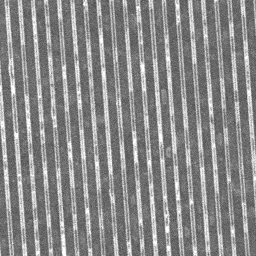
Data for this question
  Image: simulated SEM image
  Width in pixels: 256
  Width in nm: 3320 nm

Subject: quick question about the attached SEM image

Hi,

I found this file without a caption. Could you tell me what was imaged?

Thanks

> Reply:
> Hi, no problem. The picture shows parallel lines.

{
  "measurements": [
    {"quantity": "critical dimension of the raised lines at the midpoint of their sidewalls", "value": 0.0452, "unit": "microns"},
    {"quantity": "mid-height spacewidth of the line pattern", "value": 124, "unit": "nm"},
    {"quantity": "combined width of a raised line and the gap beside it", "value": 169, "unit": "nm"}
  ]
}